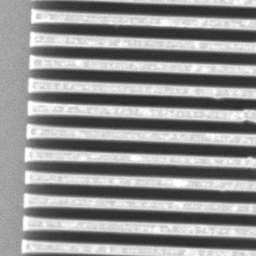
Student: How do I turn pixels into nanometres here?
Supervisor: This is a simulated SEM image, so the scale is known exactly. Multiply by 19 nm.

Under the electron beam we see parallel lines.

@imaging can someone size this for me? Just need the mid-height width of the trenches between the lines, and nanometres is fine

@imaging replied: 227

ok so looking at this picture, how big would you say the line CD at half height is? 211 nm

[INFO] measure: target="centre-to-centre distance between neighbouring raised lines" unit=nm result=437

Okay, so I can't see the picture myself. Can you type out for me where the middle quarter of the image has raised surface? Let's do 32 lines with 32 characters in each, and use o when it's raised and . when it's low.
oooooooooooooooooooooooooooooooo
.......ooooo.ooooooooooooooooooo
................................
................................
ooooooo.........................
oooooooooooooooooooooooooo......
oooooooooooooooooooooooooooooooo
............oooooooooooooooooooo
................................
................................
oooooooooooo....................
oooooooooooooooooooooooooooooooo
oooooooooooooooooooooooooooooooo
.................ooooooooooooooo
................................
................................
ooooooooooooooooo...............
oooooooooooooooooooooooooooooooo
..oooooooooooooooooooooooooooooo
......................oooooooooo
................................
................................
oooooooooooooooo................
oooooooooooooooooooooooooooooooo
.......ooooooooooooooooooooooooo
................................
................................
o...............................
ooooooooooooooooooooooooooo.....
oooooooooooooooooooooooooooooooo
.............ooooooooooooooooooo
................................